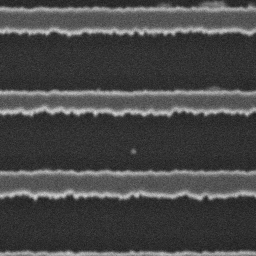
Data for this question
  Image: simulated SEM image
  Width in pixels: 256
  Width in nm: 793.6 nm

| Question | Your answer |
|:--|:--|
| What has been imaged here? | lines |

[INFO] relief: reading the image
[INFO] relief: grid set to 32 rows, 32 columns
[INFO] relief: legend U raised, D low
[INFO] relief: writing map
DDDDDDDDDDDDDDDDDDDDDDDDDDDDDDDD
UUUUUUUUUUUUUUUUUUUUUUUUUUUUUUUU
UUUUUUUUUUUUUUUUUUUUUUUUUUUUUUUU
UUUUUUUUUUUUUUUUUUUUUUUUUUUUUUUU
DDDDDDDDDDDDDDDDDDDDDDDDDDDDDDDD
DDDDDDDDDDDDDDDDDDDDDDDDDDDDDDDD
DDDDDDDDDDDDDDDDDDDDDDDDDDDDDDDD
DDDDDDDDDDDDDDDDDDDDDDDDDDDDDDDD
DDDDDDDDDDDDDDDDDDDDDDDDDDDDDDDD
DDDDDDDDDDDDDDDDDDDDDDDDDDDDDDDD
DDDDDDDDDDDDDDDDDDDDDDDDDDDDDDDD
UUUUUDUUUUUUUUUUDUUUUUUUUUUUUUUU
UUUUUUUUUUUUUUUUUUUUUUUUUUUUUUUU
UUUUUUUUUUUUUUUUUUUUUUUUUUUUUUUU
DDDDDDDDDDDDDDDDDDDDDDDDDDDDDDDD
DDDDDDDDDDDDDDDDDDDDDDDDDDDDDDDD
DDDDDDDDDDDDDDDDDDDDDDDDDDDDDDDD
DDDDDDDDDDDDDDDDDDDDDDDDDDDDDDDD
DDDDDDDDDDDDDDDDDDDDDDDDDDDDDDDD
DDDDDDDDDDDDDDDDDDDDDDDDDDDDDDDD
DDDDDDDDDDDDDDDDDDDDDDDDDDDDDDDD
UUUUUUUUUUUUUUUUUUUUUUUUUUUUUUUU
UUUUUUUUUUUUUUUUUUUUUUUUUUUUUUUU
UUUUUUUUUUUUUUUUUUUUUUUUUUUUUUUU
UUDDUDUUDUUDUUUUDDUUUUDDUUUUUDDD
DDDDDDDDDDDDDDDDDDDDDDDDDDDDDDDD
DDDDDDDDDDDDDDDDDDDDDDDDDDDDDDDD
DDDDDDDDDDDDDDDDDDDDDDDDDDDDDDDD
DDDDDDDDDDDDDDDDDDDDDDDDDDDDDDDD
DDDDDDDDDDDDDDDDDDDDDDDDDDDDDDDD
DDDDDDDDDDDDDDDDDDDDDDDDDDDDDDDD
DDDUDDDDDDDDDDDDDDDDDDDUDDDUDDUU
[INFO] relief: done